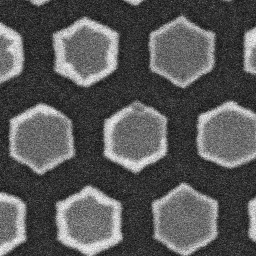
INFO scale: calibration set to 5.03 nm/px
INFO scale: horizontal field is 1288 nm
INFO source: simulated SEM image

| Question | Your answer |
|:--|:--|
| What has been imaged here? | raised bodies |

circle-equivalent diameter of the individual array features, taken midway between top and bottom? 313 nanometers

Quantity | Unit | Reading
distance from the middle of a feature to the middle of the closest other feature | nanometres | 480